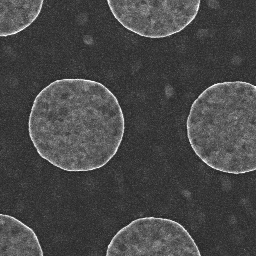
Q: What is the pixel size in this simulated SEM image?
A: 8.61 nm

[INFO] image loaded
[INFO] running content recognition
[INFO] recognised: raised bodies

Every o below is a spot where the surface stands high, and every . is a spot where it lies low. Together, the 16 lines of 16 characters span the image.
ooo....ooooo....
oo......oooo....
................
................
................
...oooo......ooo
..ooooo.....oooo
..oooooo....oooo
..oooooo....oooo
..ooooo.....oooo
....oo.......ooo
................
................
................
oo.....ooooo....
ooo....ooooo....